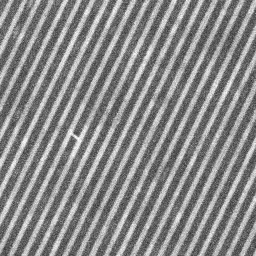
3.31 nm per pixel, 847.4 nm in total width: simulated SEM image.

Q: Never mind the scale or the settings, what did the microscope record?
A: parallel lines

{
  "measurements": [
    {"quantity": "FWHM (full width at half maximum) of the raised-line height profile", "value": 12.3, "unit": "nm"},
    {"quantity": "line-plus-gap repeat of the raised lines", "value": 12.3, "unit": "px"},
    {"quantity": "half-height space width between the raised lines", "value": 27.6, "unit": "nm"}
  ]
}